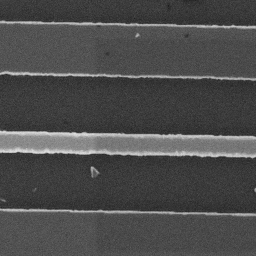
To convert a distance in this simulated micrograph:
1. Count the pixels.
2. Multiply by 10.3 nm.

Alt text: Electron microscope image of lines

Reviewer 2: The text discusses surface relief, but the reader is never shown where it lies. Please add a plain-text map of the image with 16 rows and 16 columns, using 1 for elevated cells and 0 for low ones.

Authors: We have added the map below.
0000000000000000
1111111000000000
1111111111111111
1111111111111111
1111111111111111
0000000000000000
0000000000000000
0000000000000000
1111111111111000
1111111111111111
0000000000000000
0000000000000000
0000000000000000
1111111111111111
1111111111111111
1111111111111111